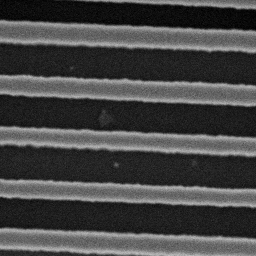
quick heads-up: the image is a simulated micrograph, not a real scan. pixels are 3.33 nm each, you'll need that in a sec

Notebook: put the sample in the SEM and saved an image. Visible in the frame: lines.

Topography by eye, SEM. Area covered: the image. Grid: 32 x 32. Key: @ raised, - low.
--------------------@@@@@@@@@@@@
--------------------------------
--------------------------------
@@@@@@@@@@@@@@@@@@@@@@@---------
@@@@@@@@@@@@@@@@@@@@@@@@@@@@@@@@
-------@@@@@@@@@@@@@@@@@@@@@@@@@
-------------------------------@
--------------------------------
--------------------------------
@@@@----------------------------
@@@@@@@@@@@@@@@@@@@@@@@@@@@@----
@@@@@@@@@@@@@@@@@@@@@@@@@@@@@@@@
-----------------@@@@@@@@@@@@@@@
--------------------------------
--------------------------------
--------------------------------
@@@@@@@@@@@@@-------------------
@@@@@@@@@@@@@@@@@@@@@@@@@@@@@@@@
-------------@@@@@@@@@@@@@@@@@@@
--------------------------------
--------------------------------
--------------------------------
@-------------------------------
@@@@@@@@@@@@@@@@@@@@@@@@@@------
@@@@@@@@@@@@@@@@@@@@@@@@@@@@@@@@
---------------------@@@@@@@@@@@
--------------------------------
--------------------------------
--------------------------------
@@@@@@@@@@@@@@@@@@@@@@-@--------
@@@@@@@@@@@@@@@@@@@@@@@@@@@@@@@@
----------@@@@@@@@@@@@@@@@@@@@@@